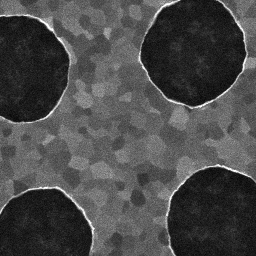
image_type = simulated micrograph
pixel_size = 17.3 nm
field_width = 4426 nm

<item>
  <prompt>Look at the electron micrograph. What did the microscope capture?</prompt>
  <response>holes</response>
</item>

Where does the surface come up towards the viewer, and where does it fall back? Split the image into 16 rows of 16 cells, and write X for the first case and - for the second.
XXXXXXXXXX----XX
---XXXXXXX-----X
----XXXXX------X
----XXXXX------X
----XXXXX------X
----XXXXXX----XX
----XXXXXXX--XXX
X-XXXXXXXXXXXXXX
XXXXXXXXXXXXXXXX
XXXXXXXXXXXXXXXX
XXXXXXXXXXXXX-XX
XXXXXXXXXXX-----
X---XXXXXXX-----
-----XXXXX------
------XXXXX-----
------XXXXX-----